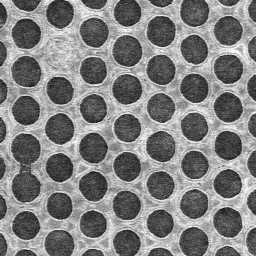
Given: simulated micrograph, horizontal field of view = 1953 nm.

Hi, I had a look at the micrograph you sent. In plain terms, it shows a regular array of holes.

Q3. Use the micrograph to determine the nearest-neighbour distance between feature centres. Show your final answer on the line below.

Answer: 290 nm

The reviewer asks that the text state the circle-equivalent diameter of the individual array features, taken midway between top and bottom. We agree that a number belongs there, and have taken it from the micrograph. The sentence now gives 228 nm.